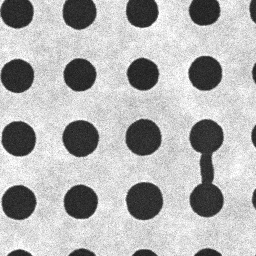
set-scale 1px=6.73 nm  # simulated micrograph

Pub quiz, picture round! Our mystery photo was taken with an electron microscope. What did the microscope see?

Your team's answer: a regular array of holes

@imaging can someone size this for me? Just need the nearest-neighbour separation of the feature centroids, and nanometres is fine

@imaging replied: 420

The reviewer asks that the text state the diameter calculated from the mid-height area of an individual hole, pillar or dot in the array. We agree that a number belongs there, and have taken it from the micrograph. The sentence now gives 0.24 micrometres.